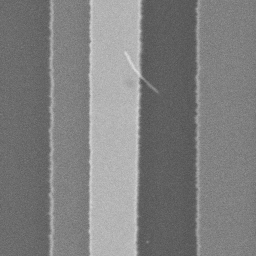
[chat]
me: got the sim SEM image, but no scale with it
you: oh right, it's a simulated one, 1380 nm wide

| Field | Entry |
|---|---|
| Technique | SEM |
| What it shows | lines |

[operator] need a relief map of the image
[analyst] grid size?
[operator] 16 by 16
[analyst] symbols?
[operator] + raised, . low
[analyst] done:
...++++++...++++
...++++++...++++
...++++++...++++
...++++++...++++
...++++++...++++
...++++++...++++
...++++++...++++
...++++++...++++
...++++++...++++
...++++++...++++
...++++++...++++
...++++++...++++
...++++++...++++
...++++++...++++
...++++++...++++
...+++++....++++